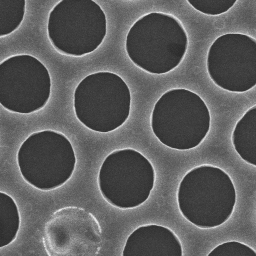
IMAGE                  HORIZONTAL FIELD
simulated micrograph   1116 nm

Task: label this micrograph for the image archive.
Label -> holes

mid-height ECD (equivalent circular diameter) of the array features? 256 nm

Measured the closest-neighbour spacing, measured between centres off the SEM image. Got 350 nm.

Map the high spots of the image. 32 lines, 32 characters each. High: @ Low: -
---@@@@-----@@@@@@@@@@@@-----@@@
---@@@-------@@@@@@@@@@@@---@@@@
---@@@-------@@@@-----@@@@@@@@@@
--@@@@-------@@@-------@@@@@@@@@
@@@@@@-------@@@-------@@@@@---@
@@@@@@@-----@@@@-------@@@@-----
@@@@@@@@---@@@@@-------@@@------
@----@@@@@@@@@@@-------@@@------
------@@@@@@@@@@@@----@@@@------
------@@@@@----@@@@@@@@@@@------
------@@@@------@@@@@@@@@@@-----
------@@@-------@@@@@---@@@@@@@@
------@@@-------@@@@-----@@@@@@@
@----@@@@-------@@@-------@@@@@-
@@@@@@@@@@------@@@-------@@@@--
@@@@@@@@@@@----@@@@-------@@@@--
@@@@@--@@@@@@@@@@@@-------@@@---
@@@-----@@@@@@@@@@@@-----@@@@---
@@@------@@@@@@@@@@@@@--@@@@@---
@@-------@@@@@----@@@@@@@@@@@@--
@@-------@@@@------@@@@@@@@@@@@-
@@@------@@@-------@@@@@----@@@@
@@@-----@@@@-------@@@@------@@@
@@@@@--@@@@@@------@@@-------@@@
-@@@@@@@@@@@@------@@@-------@@@
--@@@@@@@@@@@@----@@@@-------@@@
--@@@@@@@@@@@@@@@@@@@@@------@@@
--@@@@@@@@@@@@@@@@@@@@@@----@@@@
--@@@@@@@@@@@@@@@----@@@@@@@@@@@
--@@@@@@@@@@@@@@------@@@@@@@@@@
-@@@@@@@@@@@@@@@-------@@@@@--@@
@@@@@@@@@@@@@@@--------@@@------